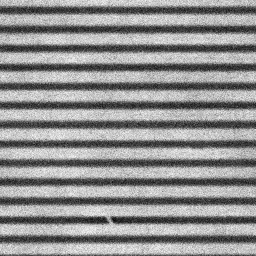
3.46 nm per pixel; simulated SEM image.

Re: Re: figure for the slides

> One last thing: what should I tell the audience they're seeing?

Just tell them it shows parallel lines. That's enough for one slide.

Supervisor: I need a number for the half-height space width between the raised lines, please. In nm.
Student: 24.2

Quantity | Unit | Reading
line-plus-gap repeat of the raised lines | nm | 66.2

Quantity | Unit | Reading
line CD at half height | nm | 41.1